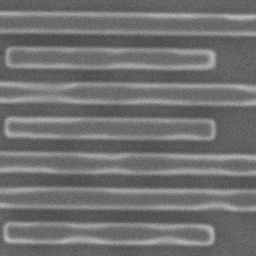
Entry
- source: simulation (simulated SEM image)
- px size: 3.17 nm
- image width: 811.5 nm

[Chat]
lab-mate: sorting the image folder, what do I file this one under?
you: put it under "groups of lines, slits or small figures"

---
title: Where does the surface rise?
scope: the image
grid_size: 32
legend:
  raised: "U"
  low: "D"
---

DDDDDDDDDDDDDDDDDDDDDDDDDDDDDDDD
DDDDDDDDDDDDDDDDDDDDDDDDDDDDDDDD
UUUUUUUUUUUUUUUUUUUUUUUUUUUUUUUU
UUUUUUUUUUUUUUUUUUUUUUUUUUUUUUUU
DDDDDDDDDDDDDDDDDDDDDDDDDDDDDDDD
DDDDDDDDDDDDDDDDDDDDDDDDDDDDDDDD
DUUUUUUUUUUUUUUUUUUUUUUUUUDDDDDD
DUUUUUUUUUUUUUUUUUUUUUUUUUUDDDDD
DDDDDDDDDUUUUUDDDDDUUUUDDDDDDDDD
DDDDDDDDDDDDDDDDDDDDDDDDDDDDDDDD
UUDDDDDDDUUUUUUUDDDDDDDDDDDDDDDD
UUUUUUUUUUUUUUUUUUUUUUUUUUUUUUUU
UUUDDDDDUUUUUUUUUUUUUUUUUUUUUUUU
DDDDDDDDDDDDDDDDDDDDDDDDDDDDDDDD
DDDDDDDDDDDDDDDDDDDDDDDDDDDDDDDD
DUUUUUUUUUUUUUUUUUUUUUUUUUUDDDDD
DUUUUUUUUUUUUUUUUUUUUUUUUUUDDDDD
DDDDDDDDDDDDDDDDDDDDDDDDDDDDDDDD
DDDDDDDDDDDDDDDDDDDDDDDDDDDDDDDD
UUUUUUUUUUUUUUUUUUUUUUUDDDDDDDDD
UUUUUUUUUUUUUUUUUUUUUUUUUUUUUUUU
DDDDDDDUUUUUUDDUUUUUUUDDDUDUUUUU
DDDDDDDDDDDDDDDDDDDDDDDDDDDDDDDD
DDDDDDDDDDDDDDDDDDDDDDDDDDDDDDDD
UUUUUUUUUUUUUUUUUUUUUUUUUUUUUUUU
UUUUUUUUUUUUUUUUUUUUUUUUUUUUUUUU
DDDDDDDDDDDDDDDDDDDDDDDDDDDDDDDD
DDDDDDDDDDDDDDDDDDDDDDDDDDDDDDDD
DUUUUUUUUUUUUUUUUUUUUUUUUUDDDDDD
DUUUUUUUUUUUUUUUUUUUUUUUUUUDDDDD
DDDDDDDDDDDDDDDDDDDDDDDDDDDDDDDD
DDDDDDDDDDDDDDDDDDDDDDDDDDDDDDDD